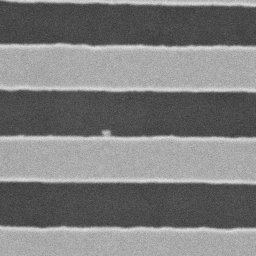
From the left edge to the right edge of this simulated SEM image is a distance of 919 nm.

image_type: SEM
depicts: lines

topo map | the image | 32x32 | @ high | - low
----------------@@@@@@@@@@@@@@@@
--------------------------------
--------------------------------
--------------------------------
--------------------------------
-------@------------------------
@@@@@@@@@@@@@@@@@@@@@@@@@@@@@@@@
@@@@@@@@@@@@@@@@@@@@@@@@@@@@@@@@
@@@@@@@@@@@@@@@@@@@@@@@@@@@@@@@@
@@@@@@@@@@@@@@@@@@@@@@@@@@@@@@@@
@@@@@@@@@@@@@@@@@@@@@@@@@@@@@@@@
--------------------------------
--------------------------------
--------------------------------
--------------------------------
--------------------------------
--------------------------------
@@@@@@@@@@@@@@@@@@@@@@@@@@@@@@@@
@@@@@@@@@@@@@@@@@@@@@@@@@@@@@@@@
@@@@@@@@@@@@@@@@@@@@@@@@@@@@@@@@
@@@@@@@@@@@@@@@@@@@@@@@@@@@@@@@@
@@@@@@@@@@@@@@@@@@@@@@@@@@@@@@@@
@@@@@@@@@@@@@@@@@@@@@@@@@@@@@@@@
--------------------------------
--------------------------------
--------------------------------
--------------------------------
--------------------------------
@@@@@-@@@@-@@@@@@@@-@@---@------
@@@@@@@@@@@@@@@@@@@@@@@@@@@@@@@@
@@@@@@@@@@@@@@@@@@@@@@@@@@@@@@@@
@@@@@@@@@@@@@@@@@@@@@@@@@@@@@@@@